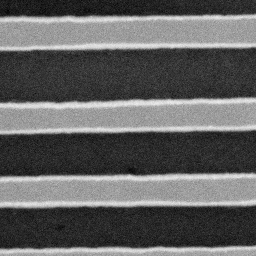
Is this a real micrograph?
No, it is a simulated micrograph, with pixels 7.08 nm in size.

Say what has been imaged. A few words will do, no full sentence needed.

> lines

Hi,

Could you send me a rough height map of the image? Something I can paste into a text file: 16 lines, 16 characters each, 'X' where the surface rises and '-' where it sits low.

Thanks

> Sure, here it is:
----------------
XXXXXXXXXXXXXXXX
XXXXXXXXXXXXXXXX
----------------
----------------
----------------
X-XXXXXXXXXXXXXX
XXXXXXXXXXXXXXXX
----------------
----------------
----------------
XXXXXXXXXXXXXXXX
XXXXXXXXXXXXXXXX
----------------
----------------
---------XX-XXXX